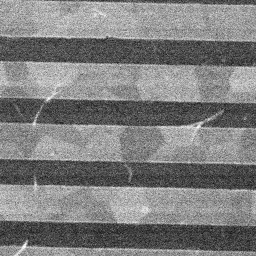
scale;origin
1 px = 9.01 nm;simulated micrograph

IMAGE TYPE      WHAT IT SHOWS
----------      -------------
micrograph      parallel lines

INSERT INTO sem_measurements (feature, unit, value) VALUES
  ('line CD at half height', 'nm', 316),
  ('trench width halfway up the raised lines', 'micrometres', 0.238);